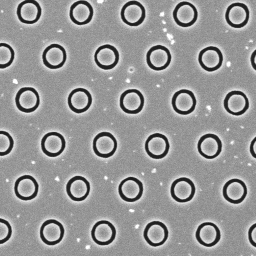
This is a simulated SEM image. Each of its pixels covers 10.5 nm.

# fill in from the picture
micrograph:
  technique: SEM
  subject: a regular array of ring-shaped grooves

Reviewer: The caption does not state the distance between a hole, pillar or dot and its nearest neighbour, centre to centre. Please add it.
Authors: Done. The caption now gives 0.535 um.